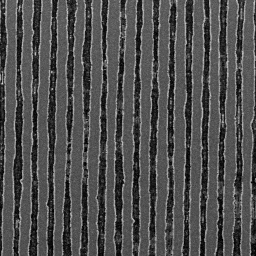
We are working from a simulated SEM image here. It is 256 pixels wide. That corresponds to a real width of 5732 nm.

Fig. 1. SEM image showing parallel lines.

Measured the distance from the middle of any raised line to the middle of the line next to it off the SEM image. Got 380 nanometres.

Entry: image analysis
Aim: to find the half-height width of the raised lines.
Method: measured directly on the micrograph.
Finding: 0.235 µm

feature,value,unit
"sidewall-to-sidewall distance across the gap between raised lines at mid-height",137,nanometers